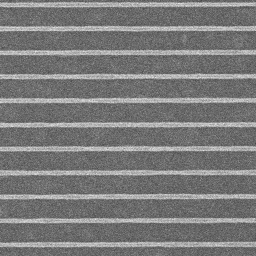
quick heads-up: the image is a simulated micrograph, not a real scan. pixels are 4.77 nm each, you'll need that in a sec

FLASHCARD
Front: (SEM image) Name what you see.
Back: parallel lines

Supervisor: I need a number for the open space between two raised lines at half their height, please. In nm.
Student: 97.9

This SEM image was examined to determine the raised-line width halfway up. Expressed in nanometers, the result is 14.3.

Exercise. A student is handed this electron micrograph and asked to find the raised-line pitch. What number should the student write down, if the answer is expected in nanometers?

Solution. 114